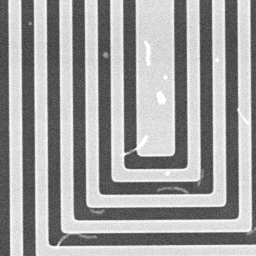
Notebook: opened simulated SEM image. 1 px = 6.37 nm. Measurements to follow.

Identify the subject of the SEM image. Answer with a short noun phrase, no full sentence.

groups of lines, slits or small figures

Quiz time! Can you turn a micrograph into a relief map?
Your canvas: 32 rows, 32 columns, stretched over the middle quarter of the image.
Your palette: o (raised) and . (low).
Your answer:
oo....oo....ooo...ooooooooo....o
oo....oo....ooo...ooooooooo....o
oo....oo....ooo...oooooooooo...o
oo....oo....ooo...oooooooooo...o
oo....oo....ooo...oooooooooo...o
oo....oo....ooo...oooooooooo...o
oo....oo....ooo...oooooooooo...o
oo....oo....ooo...oooooooooo...o
oo....oo....ooo...oooooooooo...o
oo....oo....ooo...oooooooooo...o
oo....oo....ooo...oooooooooo...o
oo....oo....ooo...oooooooooo...o
oo....oo....ooo...oooooooooo...o
oo....oo....ooo...oooooooooo...o
oo....ooo...ooo...oooooooooo...o
oo....ooo...ooo...oooooooooo...o
oo....ooo...ooo...oooooooooo...o
oo....ooo...ooo...oooooooooo...o
oo....ooo...ooo...oooooooooo...o
oo....ooo...ooo...oooooooooo...o
oo....ooo...ooo...oooooooooo...o
oo....ooo...ooo...oooooooooo...o
oo....ooo...ooo...ooooooooo....o
oo....ooo...ooo................o
oo....ooo...ooo................o
oo....ooo...ooo................o
oo....ooo...oooo........oooooooo
oo....ooo...oooooooooooooooooooo
oo....ooo...oooooooooooooooooooo
oo....ooo.......................
oo....ooo.......................
oo....ooo.......................